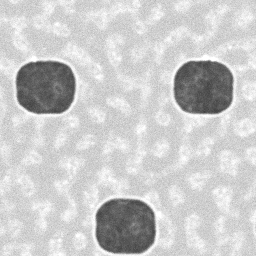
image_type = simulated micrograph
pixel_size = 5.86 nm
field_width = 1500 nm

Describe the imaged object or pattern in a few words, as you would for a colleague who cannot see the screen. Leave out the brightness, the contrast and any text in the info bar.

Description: holes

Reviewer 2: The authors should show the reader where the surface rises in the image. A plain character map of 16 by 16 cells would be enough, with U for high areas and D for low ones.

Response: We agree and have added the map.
UUUUUUUUUUUUUUUU
UUUUUUUUUUUUUUUU
UUUUUUUUUUUUUUUU
UUUUUUUUUUUUUUUU
UDDDDUUUUUUDDDUU
UDDDDUUUUUUDDDDU
UDDDUUUUUUUDDDUU
UUUUUUUUUUUUUUUU
UUUUUUUUUUUUUUUU
UUUUUUUUUUUUUUUU
UUUUUUUUUUUUUUUU
UUUUUUUUUUUUUUUU
UUUUUUUDDUUUUUUU
UUUUUUDDDDUUUUUU
UUUUUUDDDDUUUUUU
UUUUUUDDDUUUUUUU